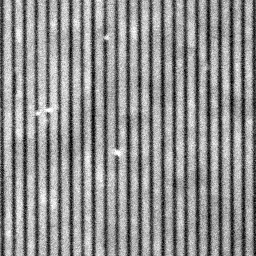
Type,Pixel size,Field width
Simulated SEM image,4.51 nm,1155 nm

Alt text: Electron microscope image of parallel lines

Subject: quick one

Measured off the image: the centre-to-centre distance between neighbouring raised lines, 51.8 nanometres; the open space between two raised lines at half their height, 16.4 nm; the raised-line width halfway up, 36.7 nm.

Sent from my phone